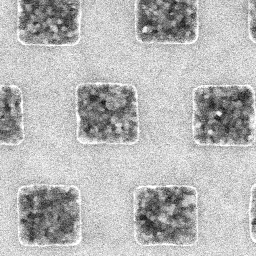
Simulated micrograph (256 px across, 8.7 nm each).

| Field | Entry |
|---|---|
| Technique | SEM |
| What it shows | raised bodies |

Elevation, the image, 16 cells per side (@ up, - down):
-@@@@---@@@@----
-@@@@---@@@@----
-@@@@----@@@----
----------------
----------------
@----@@@----@@@@
@----@@@@---@@@@
@----@@@@---@@@@
@----@@@@---@@@@
----------------
----------------
----------------
-@@@@---@@@@----
-@@@@---@@@@----
-@@@@---@@@@----
----------------